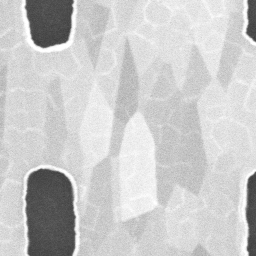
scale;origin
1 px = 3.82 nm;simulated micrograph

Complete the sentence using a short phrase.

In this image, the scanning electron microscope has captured holes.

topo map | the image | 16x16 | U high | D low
UUDDDUUUUUUUUUUD
UUDDUUUUUUUUUUUD
UUDDUUUUUUUUUUUU
UUUUUUUUUUUUUUUU
UUUUUUUUUUUUUUUU
UUUUUUUUUUUUUUUU
UUUUUUUUUUUUUUUU
UUUUUUUUUUUUUUUU
UUUUUUUUUUUUUUUU
UUUUUUUUUUUUUUUU
UUUUUUUUUUUUUUUU
UUDDUUUUUUUUUUUD
UUDDDUUUUUUUUUUD
UUDDDUUUUUUUUUUD
UUDDDUUUUUUUUUUU
UUDDDUUUUUUUUUUD